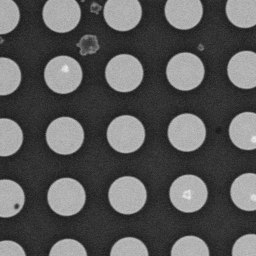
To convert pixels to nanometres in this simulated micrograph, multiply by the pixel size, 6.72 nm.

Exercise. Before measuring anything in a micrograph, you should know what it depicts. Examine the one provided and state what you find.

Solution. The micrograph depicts an array of small figures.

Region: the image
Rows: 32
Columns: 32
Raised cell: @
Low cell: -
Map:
@@----@@@@---@@@@----@@@@---@@@@
@@---@@@@@---@@@@@---@@@@---@@@@
@@----@@@@---@@@@----@@@@----@@@
@@----@@@-----@@@-----@@--------
--------------------------------
--------------------------------
------------------------------@-
@-----@@@-----@@@----@@@@----@@@
@@----@@@@---@@@@@---@@@@---@@@@
@@@---@@@@---@@@@@---@@@@----@@@
@@----@@@@----@@@----@@@@----@@@
@@-----@@-----------------------
--------------------------------
--------------------------------
---------------@------@@------@@
@@----@@@@----@@@@---@@@@----@@@
@@@---@@@@---@@@@@---@@@@@---@@@
@@@---@@@@----@@@@---@@@@----@@@
@@----@@@@----@@@-----@@@-----@@
--------------------------------
--------------------------------
--------------------------------
-------@@------@@-----@@@----@@@
@@@---@@@@----@@@@---@@@@@---@@@
@@@---@@@@@---@@@@---@@@@@---@@@
@@@---@@@@----@@@@----@@@----@@@
@@-----@@@-----@@------@--------
--------------------------------
--------------------------------
------------------------------@@
@@-----@@@----@@@@----@@@@---@@@
@@@---@@@@@---@@@@---@@@@@---@@@